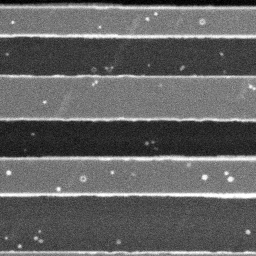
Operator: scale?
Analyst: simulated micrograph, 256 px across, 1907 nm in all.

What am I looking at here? lines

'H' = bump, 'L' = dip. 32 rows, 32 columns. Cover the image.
LLLLLLLLLLLLLLLLLLLLLLLLLLLLLLLL
HHHHHHHHHHHHHHHHHHHHHHHHHHHHHHHH
HHHHHHHHHHHHHHHHHHHHHHHHHHHHHHHH
HHHHHHHHHHHHHHHHHHHHHHHHHHHHHHHH
LLLLLLLLLLHHHHHHHHHHHHHHHHHHHHHH
LLLLLLLLLLLLLLLLLLLLLLLLLLLLLLLL
LLLLLLLLLLLLLLLLLLLLLLLLLLLLLLLL
LLLLLLLLLLLLLLLLLLLLLLLLLLLLLLLL
LLLLLLLLLLLLLLLLLLLLLLLLLLLLLLLL
HHHHLLHHLLHHLLLHHLLLLLLLLLLLLLLL
HHHHHHHHHHHHHHHHHHHHHHHHHHHHHHHH
HHHHHHHHHHHHHHHHHHHHHHHHHHHHHHHH
HHHHHHHHHHHHHHHHHHHHHHHHHHHHHHHH
HHHHHHHHHHHHHHHHHHHHHHHHHHHHHHHH
HHHHHHHHHHHHHHHHHHHHHHHHHHHHHHHH
LLLLLLLLLLLLLLLLLLLLLLLLLLLLLLLL
LLLLLLLLLLLLLLLLLLLLLLLLLLLLLLLL
LLLLLLLLLLLLLLLLLLLLLLLLLLLLLLLL
LLLLLLLLLLLLLLLLLLLLLLLLLLLLLLLL
LLLLLLLLLLLLLLLLLLLLLLLLLLLLLLLL
HHHHHHHHHHHHHHHHHHHHHHHHHHHHHHHH
HHHHHHHHHHHHHHHHHHHHHHHHHHHHHHHH
HHHHHHHHHHHHHHHHHHHHHHHHHHHHHHHH
HHHHHHHHHHHHHHHHHHHHHHHHHHHHHHHH
LLLLLLLLLLLLLLLLLLLLLLLLLLLLLLHL
LLLLLLLLLLLLLLLLLLLLLLLLLLLLLLLL
LLLLLLLLLLLLLLLLLLLLLLLLLLLLLLLL
LLLLLLLLLLLLLLLLLLLLLLLLLLLLLLLL
LLLLLLLLLLLLLLLLLLLLLLLLLLLLLLLL
LLLLLLLLLLLLLLLLLLLLLLLLLLLLLLLL
LLLLLLLLLLLLLLLLLLLLLLLLLLLLLLLL
LLLLLLLLLLLLLLLLLLLLLLLLLLLLLLLL